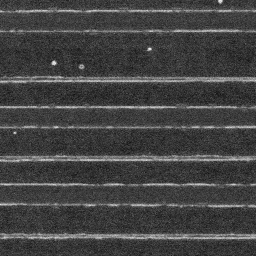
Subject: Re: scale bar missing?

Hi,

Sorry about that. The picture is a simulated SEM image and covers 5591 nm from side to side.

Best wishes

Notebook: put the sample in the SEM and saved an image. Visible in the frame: lines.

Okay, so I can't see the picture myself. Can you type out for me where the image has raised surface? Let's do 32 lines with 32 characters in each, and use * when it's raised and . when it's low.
................................
*.******************************
********************************
********************************
................................
................................
................................
................................
................................
................................
................................
................................
................................
******************************.*
********************************
********************************
................................
................................
................................
................................
................................
................................
................................
********************************
********************************
********************************
................................
................................
................................
................................
................................
................................